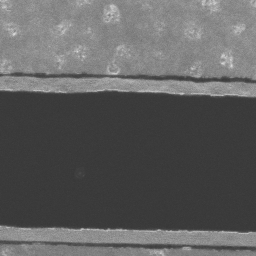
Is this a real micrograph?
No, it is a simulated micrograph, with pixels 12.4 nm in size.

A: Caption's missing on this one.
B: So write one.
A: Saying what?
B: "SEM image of one or a few lines or trenches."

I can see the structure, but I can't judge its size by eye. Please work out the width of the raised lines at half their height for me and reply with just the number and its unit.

1890 nanometers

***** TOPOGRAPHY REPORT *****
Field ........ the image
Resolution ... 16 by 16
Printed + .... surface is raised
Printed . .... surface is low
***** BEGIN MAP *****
................
................
................
................
................
++++++++++++++..
++++++++++++++++
++++++++++++++++
++++++++++++++++
++++++++++++++++
++++++++++++++++
++++++++++++++++
++++++++++++++++
++++++++++++++++
++++++++++++++++
................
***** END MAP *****